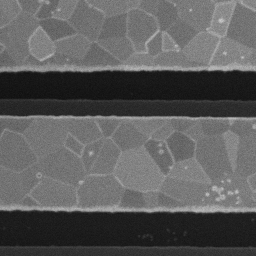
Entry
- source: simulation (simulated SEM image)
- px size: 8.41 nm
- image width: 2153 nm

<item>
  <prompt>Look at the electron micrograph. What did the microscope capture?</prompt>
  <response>lines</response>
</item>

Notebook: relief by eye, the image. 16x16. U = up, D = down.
UUUUUUUUUUUUUUUU
UUUUUUUUUUUUUUUU
UUUUUUUUUUUUUUUU
UUUUUUUUUUUUUUUU
DDDDDDDDDDDDDDDD
DDDDDDDDDDDDDDDD
DDDDDDDDDDDDDDDD
UUUUUUUUUUUUUUUU
UUUUUUUUUUUUUUUU
UUUUUUUUUUUUUUUU
UUUUUUUUUUUUUUUU
UUUUUUUUUUUUUUUU
UUUUUUUUUUUUUUUU
DDDDDDDDDDDDDDDD
DDDDDDDDDDDDDDDD
DDDDDDDDDDDDDDDD